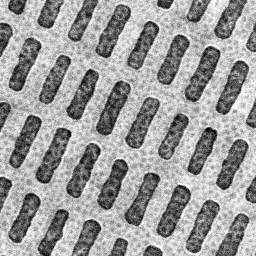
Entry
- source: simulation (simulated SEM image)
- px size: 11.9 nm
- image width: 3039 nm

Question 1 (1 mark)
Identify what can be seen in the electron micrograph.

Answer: a regular array of holes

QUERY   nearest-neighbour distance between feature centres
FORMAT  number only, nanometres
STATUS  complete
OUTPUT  386